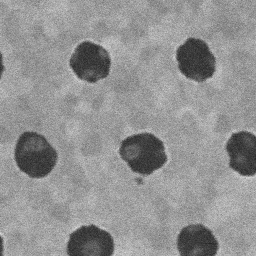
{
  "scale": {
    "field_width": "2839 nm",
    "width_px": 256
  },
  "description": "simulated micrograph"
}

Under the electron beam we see holes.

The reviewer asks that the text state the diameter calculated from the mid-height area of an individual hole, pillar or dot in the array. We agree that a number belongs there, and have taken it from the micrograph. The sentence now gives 487 nm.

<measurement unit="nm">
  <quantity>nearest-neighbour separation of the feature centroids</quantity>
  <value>1180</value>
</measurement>